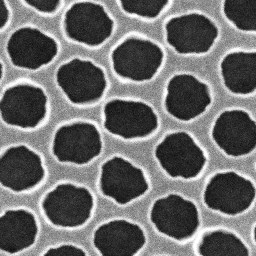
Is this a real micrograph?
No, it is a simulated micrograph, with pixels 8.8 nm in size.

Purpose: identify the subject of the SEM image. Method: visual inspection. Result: a regular array of holes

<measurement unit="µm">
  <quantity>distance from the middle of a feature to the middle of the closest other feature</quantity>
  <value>0.52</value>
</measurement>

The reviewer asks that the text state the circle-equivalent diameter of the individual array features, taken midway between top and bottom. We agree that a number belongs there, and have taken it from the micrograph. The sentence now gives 411 nanometers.